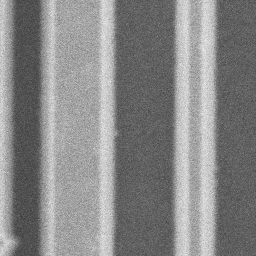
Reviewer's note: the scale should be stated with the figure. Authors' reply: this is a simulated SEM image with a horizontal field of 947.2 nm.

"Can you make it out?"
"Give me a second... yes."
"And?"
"one or a few lines or trenches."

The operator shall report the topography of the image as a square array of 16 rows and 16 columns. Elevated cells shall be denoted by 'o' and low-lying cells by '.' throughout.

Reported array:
...oooo....oo...
...oooo....oo...
...oooo....oo...
...oooo....oo...
...oooo....oo...
...oooo....oo...
...oooo....oo...
...oooo....oo...
...oooo....oo...
...oooo....oo...
...oooo....oo...
...oooo....oo...
...oooo....oo...
...oooo....oo...
...oooo....oo...
o..oooo....oo...